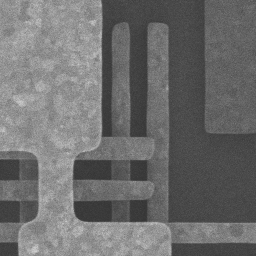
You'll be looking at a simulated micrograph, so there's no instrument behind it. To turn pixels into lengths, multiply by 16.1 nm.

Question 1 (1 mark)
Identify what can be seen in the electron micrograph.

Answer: wiring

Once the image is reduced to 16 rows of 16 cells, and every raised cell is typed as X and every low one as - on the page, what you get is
XXXXXX----------
XXXXXX----------
XXXXXX----------
XXXXXX----------
XXXXXX----------
XXXXXX----------
XXXXXX----------
XXXXXX----------
XXXXXX----------
--XXX-----------
--XXX-----------
--XXX-----------
--XXX-----------
--XXX-----------
-XXXXXXXXXX-----
-XXXXXXXXXX-----